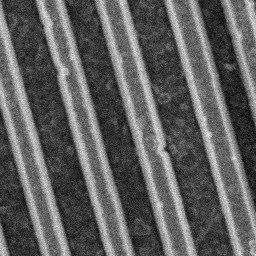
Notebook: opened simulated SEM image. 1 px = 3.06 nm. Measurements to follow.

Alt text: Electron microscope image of parallel lines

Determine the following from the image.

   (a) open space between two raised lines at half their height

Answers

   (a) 40.1 px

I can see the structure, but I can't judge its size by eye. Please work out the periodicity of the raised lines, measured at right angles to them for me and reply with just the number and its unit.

191 nm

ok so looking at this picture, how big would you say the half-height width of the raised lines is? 72 nm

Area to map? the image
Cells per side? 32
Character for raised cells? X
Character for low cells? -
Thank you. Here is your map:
-----XXX----XXX------XXX----XXX-
-----XXX-----XXX-----XXXX---XXX-
------XX-----XXX------XXX----XXX
X-----XX-----XXX------XXX----XXX
X-----XXX-----XXX-----XXXX---XXX
X-----XXX-----XXX------XXX----XX
X------XX-----XXX------XXX----XX
XX-----XXX----XXX------XXX----XX
XX-----XXX-----XXX-----XXXX---XX
XX------XX-----XXX------XXX----X
XX------XXX----XXX------XXX----X
XXX-----XXX----XXXX-----XXX----X
XXX-----XXX-----XXX-----XXXX----
XXX------XX-----XXX------XXX----
-XXX-----XXX----XXX------XXX----
-XXX-----XXX-----XXX-----XXXX---
-XXX-----XXX-----XXX------XXX---
--XX------XX-----XXX------XXX---
--XXX-----XXX----XXX------XXX---
--XXX-----XXX-----XXX-----XXXX--
--XXX-----XXX-----XXX------XXX--
---XXX-----XXX----XXX------XXX--
---XXX-----XXX-----XXX-----XXX--
---XXX-----XXX-----XXX------XXX-
----XX------XX-----XXX------XXX-
----XXX-----XXX----XXX------XXX-
----XXX-----XXX-----XXX-----XXXX
----XXX-----XXX-----XXX------XXX
-----XX------XXX----XXX------XXX
-----XXX-----XXX----XXX------XXX
-----XXX-----XXX-----XXX-----XXX
X----XXX------XX-----XXX------XX